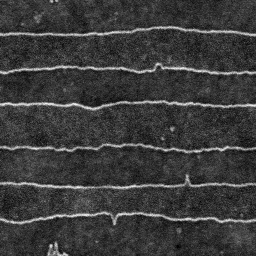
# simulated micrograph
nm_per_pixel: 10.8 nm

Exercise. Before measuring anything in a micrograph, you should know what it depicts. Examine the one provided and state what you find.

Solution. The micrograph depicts one or a few lines or trenches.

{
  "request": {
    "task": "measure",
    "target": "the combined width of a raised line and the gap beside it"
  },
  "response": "0.81 µm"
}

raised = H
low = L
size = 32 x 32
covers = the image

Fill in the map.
LLLLLLLLLLLLLLLLLLLLLLLLLLLLLLLL
LLLLLLLLLLLLLLLLLLLLLLLLLLLLLLLL
LLLLLLLLLLLLLLLLLLLLLLLLLLLLLLLL
LLLLLLLLLLLLLLLLLLLLLHLLLLLLLLLL
HHHHHHHHHHHHHHHHHHHHHHHHHHHHHHHH
HHHHHHHHHHHHHHHHHHHHHHHHHHHHHHHH
HHHHHHHHHHHHHHHHHHHHHHHHHHHHHHHH
HHHHHHHHHHHHHHHHHHHHHHHHHHHHHHHH
HHHHHHHLLLHHHHHHHHHLLHHHHHHHHHHH
LLLLLLLLLLLLLLLLLLLLLLLLLLLLLLLL
LLLLLLLLLLLLLLLLLLLLLLLLLLLLLLLL
LLLLLLLLLLLLLLLLLLLLLLLLLLLLLLLL
LLLLLLLLLLLLLLLLLLLLLLLLLLLLLLLL
HHHHHHHHHHHLHHHHHHHHHHHHHHHHHHHH
HHHHHHHHHHHHHHHHHHHHHHHHHHHHHHHH
HHHHHHHHHHHHHHHHHHHHHHHHHHHHHHHH
HHHHHHHHHHHHHHHHHHHHHHHHHHHHHHHH
HHHHHHHHHHHHHHHHHHHHHHHHHHHHHHHH
LHLLHHHHHHHHLLLLLLLHHHHHHHHHLHHH
LLLLLLLLLLLLLLLLLLLLLLLLLLLLLLLL
LLLLLLLLLLLLLLLLLLLLLLLLLLLLLLLL
LLLLLLLLLLLLLLLLLLLLLLLLLLLLLLLL
LLLLLLLLLLLLLLLLLLLLLLLLLLLLLLLL
HHHHHHHHHHHHHHHHHHHHHHHHHHHHHHHH
HHHHHHHHHHHHHHHHHHHHHHHHHHHHHHHH
HHHHHHHHHHHHHHHHHHHHHHHHHHHHHHHH
HHHHHHHHHHHHHHHHHHHHHHHHHHHHHHHH
HHHHLLLLLLLLLLLLLLLLLLHLLLLHHHHH
LLLLLLLLLLLLLLLLLLLLLLLLLLLLLLLL
LLLLLLLLLLLLLLLLLLLLLLLLLLLLLLLL
LLLLLLLLLLLLLLLLLLLLLLLLLLLLLLLL
LLLLLLHLLLLLLLLLLLLLLLLLLLLLLLLL